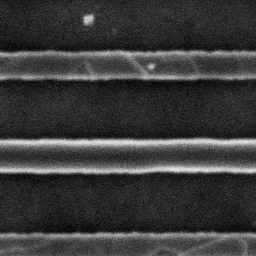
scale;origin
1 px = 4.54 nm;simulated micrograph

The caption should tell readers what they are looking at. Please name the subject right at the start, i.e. lines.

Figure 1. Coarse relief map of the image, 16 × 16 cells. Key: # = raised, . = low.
................
................
................
################
################
................
................
................
................
################
################
................
................
................
................
################